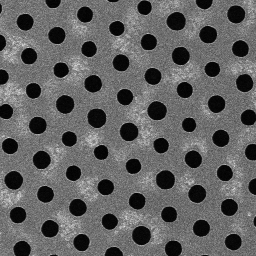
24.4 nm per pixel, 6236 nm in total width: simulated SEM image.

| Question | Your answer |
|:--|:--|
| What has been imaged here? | a regular array of holes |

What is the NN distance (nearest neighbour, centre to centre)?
840 nm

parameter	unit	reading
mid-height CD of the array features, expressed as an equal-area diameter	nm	417